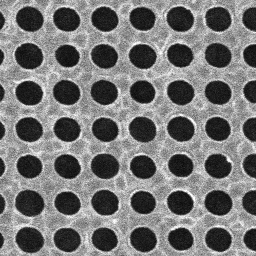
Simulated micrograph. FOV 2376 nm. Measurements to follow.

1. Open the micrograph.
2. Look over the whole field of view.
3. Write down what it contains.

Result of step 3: a regular array of holes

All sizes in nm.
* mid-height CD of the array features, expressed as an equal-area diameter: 243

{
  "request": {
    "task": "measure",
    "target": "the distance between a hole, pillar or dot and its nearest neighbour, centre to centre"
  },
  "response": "0.338 um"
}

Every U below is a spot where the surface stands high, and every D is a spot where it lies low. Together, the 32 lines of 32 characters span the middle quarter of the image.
DDDUUUUUDDDDDUUUUUDDDDUUUUUUDDDU
UUUUUUUUUUUUUUUUUUUUUUUUUUUUUUUU
UUUUUUUUUUUUUUUUUUUUUUUUUUUUUUUU
UUUUUUUUUUUUUUUUUUUUUUUUUUUUUUUU
DDUUUUUUDDDDUUUUUUDDDDUUUUUDDDDU
DDDDUUUDDDDDDUUUUDDDDDUUUUDDDDDD
DDDDUUUDDDDDDUUUDDDDDDDUUUDDDDDD
DDDDUUUDDDDDDDUUDDDDDDDUUUDDDDDD
DDDDUUUDDDDDDUUUUDDDDDDUUUDDDDDD
DDDUUUUUDDDDDUUUUUDDDDUUUUUDDDDD
UUUUUUUUUUUUUUUUUUUUUUUUUUUUUDUU
UUUUUUUUUUUUUUUUUUUUUUUUUUUUUUUU
UUUUUUUUUUUUUUUUUUUUUUUUUUUUUUUU
DDUUUUUUUDDUUUUUUUDDDUUUUUUDDDDU
DDDUUUUDDDDDDUUUDDDDDDDUUUDDDDDD
DDDDUUUDDDDDDUUUDDDDDDDUUUDDDDDD
DDDDUUUDDDDDDDUUDDDDDDDUUUDDDDDD
DDDDUUUDDDDDDUUUDDDDDDDUUUDDDDDD
DDDUUUUUDDDDDUUUUDDDDDDUUUUDDDDD
DDUUUUUUUUDUUUUUUUUDDUUUUUUUUDUU
UUUUUUUUUUUUUUUUUUUUUUUUUUUUUUUU
UUUUUUUUUUUUUUUUUUUUUUUUUUUUUUUU
DUUUUUUUUDDUUUUUUUUUUUUUUUUUDDUU
DDDUUUUDDDDDDUUUUDDDDDUUUUDDDDDU
DDDDUUUDDDDDDDUUUDDDDDDUUUDDDDDD
DDDDUUDDDDDDDDUUDDDDDDDUUUDDDDDD
DDDDUUUDDDDDDDUUDDDDDDDUUUDDDDDD
DDDDUUUDDDDDDUUUUDDDDDDUUUUDDDDD
DDDUUUUUUDDDUUUUUUUDDUUUUUUUUUUU
UUUUUUUUUUUUUUUUUUUUUUUUUUUUUUUU
UUUUUUUUUUUUUUUUUUUUUUUUUUUUUUUU
UUUUUUUUUDDUUUUUUUUUUUUUUUUUDUUU